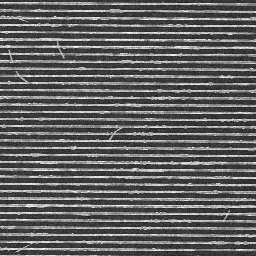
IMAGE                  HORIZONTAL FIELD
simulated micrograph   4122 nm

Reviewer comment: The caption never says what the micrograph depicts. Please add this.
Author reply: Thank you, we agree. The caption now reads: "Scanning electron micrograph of parallel lines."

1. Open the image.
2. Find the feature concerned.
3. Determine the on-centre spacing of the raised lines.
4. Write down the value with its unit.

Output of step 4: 0.116 micrometres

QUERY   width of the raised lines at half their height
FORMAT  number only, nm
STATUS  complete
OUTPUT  32.2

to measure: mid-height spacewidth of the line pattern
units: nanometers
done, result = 82.5